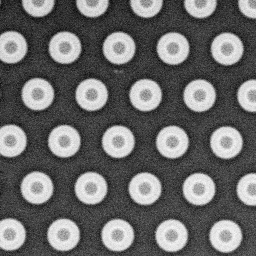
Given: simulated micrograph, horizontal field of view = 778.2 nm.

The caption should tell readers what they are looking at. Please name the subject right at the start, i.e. an array of small figures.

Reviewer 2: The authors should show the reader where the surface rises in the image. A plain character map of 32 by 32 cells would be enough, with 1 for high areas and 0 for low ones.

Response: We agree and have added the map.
00011110001110001111000111100011
00011100001110000111000011100011
00000000000000000000000000000000
00000000000000000000000000000000
11100001100000110000111000011000
11100011110001111000111100011100
11100011110001111000111100111100
11100001100000110000111000011100
00000000000000000000000000000000
00000000000000000000000000000000
00011100001110000111000011000011
00011110001110001111000111100011
00011110001110001111000111100011
00001100001100000110000011000011
00000000000000000000000000000000
00000000000000000000000000000000
11100011110001110000111000011100
11100011110001111000111000111100
11100011110001111000111000111100
01000001100000110000010000011000
00000000000000000000000000000000
00000000000000000000000000000000
00011100001110000111000111000011
00011110011110001111000111100011
00011100001110001111000111100011
00000000000000000010000011000001
00000000000000000000000000000000
11000001100000100000000000000000
11100011110001110000111000011100
11100011110001111000111000111100
11100011110001110000111000011100
00000000000000000000000000000000